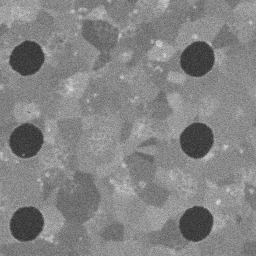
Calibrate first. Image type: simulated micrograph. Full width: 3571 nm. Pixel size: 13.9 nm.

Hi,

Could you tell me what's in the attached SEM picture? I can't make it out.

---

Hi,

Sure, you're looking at holes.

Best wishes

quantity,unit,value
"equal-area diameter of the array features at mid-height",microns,0.499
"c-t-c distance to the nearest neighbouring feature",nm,1150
